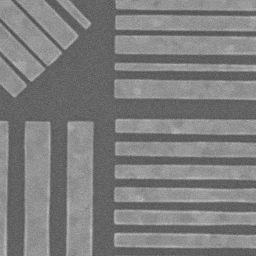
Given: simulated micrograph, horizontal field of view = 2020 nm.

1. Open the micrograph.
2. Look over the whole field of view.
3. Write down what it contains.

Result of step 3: groups of lines, slits or small figures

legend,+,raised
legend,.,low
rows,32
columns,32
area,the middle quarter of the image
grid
.............+++++++++++++++++++
.............+++++++++++++++++++
................................
................................
.............+++++++++++++++++++
.............+++++++++++++++++++
.............+++++++++++++++++++
.............+++++++++++++++++++
.........................+++++++
................................
................................
................................
................................
................................
...++++......+++++++++++++++++++
.++++++......+++++++++++++++++++
.++++++......+++++++++++++++++++
.++++++.........................
.++++++.........................
.++++++.........................
.++++++......+++++++++++++++++++
.++++++......+++++++++++++++++++
.++++++......+++++++++++++++++++
.++++++.........................
.++++++.........................
.++++++......+++++++++++++++++++
.++++++......+++++++++++++++++++
.++++++......+++++++++++++++++++
.++++++.........................
.++++++.........................
.++++++.........................
.++++++......+++++++++++++++++++